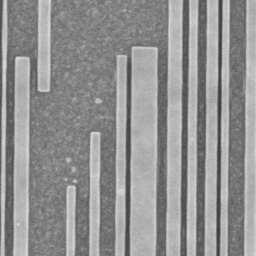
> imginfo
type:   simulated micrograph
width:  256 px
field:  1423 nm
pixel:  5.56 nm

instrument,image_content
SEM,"groups of lines, slits or small figures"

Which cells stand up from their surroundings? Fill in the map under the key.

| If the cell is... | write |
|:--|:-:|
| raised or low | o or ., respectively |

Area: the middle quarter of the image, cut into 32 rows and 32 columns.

.............ooo.oooooo...ooo..o
.............ooo.oooooo...ooo..o
.............ooo.oooooo...ooo..o
.............ooo.oooooo...ooo..o
.............ooo.oooooo...ooo..o
.............ooo.oooooo...ooo..o
.............ooo.oooooo...ooo..o
.............ooo.oooooo...ooo..o
.............ooo.oooooo...ooo..o
.............ooo.oooooo...ooo..o
.............ooo.oooooo...ooo..o
.............ooo.oooooo...ooo..o
.............ooo.oooooo...ooo..o
.............ooo.oooooo...ooo..o
.............ooo.oooooo...ooo..o
.............ooo.oooooo...ooo..o
.............oo..oooooo...ooo..o
.......oo....oo..oooooo...ooo..o
.......oo....oo..oooooo...ooo..o
.......oo....oo..oooooo...ooo..o
.......oo....oo..oooooo...ooo..o
.......oo....oo..oooooo...ooo..o
.......oo....oo..oooooo...ooo..o
.......oo....oo..oooooo...ooo..o
.......oo....oo..oooooo...ooo..o
.......oo....oo..oooooo...ooo..o
.......oo....oo..oooooo...ooo..o
.......oo....oo..oooooo...ooo..o
.......oo....oo..oooooo...ooo..o
.......oo....oo..oooooo...ooo..o
.......oo....oo..oooooo...ooo..o
.oo....oo....oo..oooooo...ooo..o